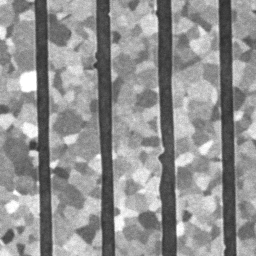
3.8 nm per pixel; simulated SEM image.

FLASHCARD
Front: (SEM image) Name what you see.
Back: one or a few lines or trenches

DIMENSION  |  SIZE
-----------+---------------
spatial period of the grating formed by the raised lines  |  234 nanometers